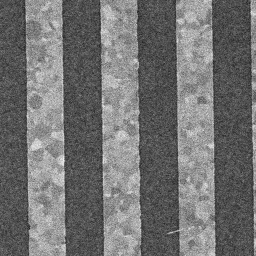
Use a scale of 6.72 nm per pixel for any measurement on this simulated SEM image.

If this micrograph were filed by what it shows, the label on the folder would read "one or a few lines or trenches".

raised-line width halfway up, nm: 240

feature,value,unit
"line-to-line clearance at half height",0.265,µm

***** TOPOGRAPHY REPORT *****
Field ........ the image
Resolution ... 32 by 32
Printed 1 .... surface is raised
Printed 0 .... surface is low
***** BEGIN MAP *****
00011111000001111000001111100001
00011111000001111000001111000001
00011111000001111000001111100001
00011111000001111000001111000001
00011111000001111000001111100001
00011111000001111000001111100001
00011111000001111000001111000001
00011111000001111000001111000001
00011111000001111000001111000000
00011111000001111000001111100000
00011111000001111000001111100000
00011111000001111000001111100001
00011111000001111000001111100001
00011111000001111000001111100001
00011111000001111000001111100000
00011111000001111000001111100000
00011111000001111000001111100000
00011111000001111000001111100000
00011111000001111000001111100000
00011111000001111000001111100000
00001111000001111000001111100000
00011111000001111000001111100000
00011111000001111000001111100000
00001111000001111100001111100000
00001111000001111000001111100000
00001111000001111000001111100000
00001111000001111100001111100000
00001111000001111000001111100000
00001111000001111100001111100000
00001111000001111100000111100000
00001111000001111100000111100000
00001111000001111100000111100000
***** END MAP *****